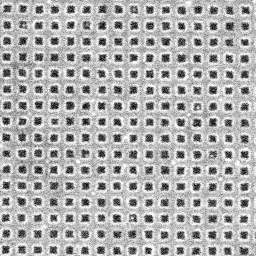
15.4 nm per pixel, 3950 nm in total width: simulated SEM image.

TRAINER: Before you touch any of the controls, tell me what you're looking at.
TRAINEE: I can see a regular array of holes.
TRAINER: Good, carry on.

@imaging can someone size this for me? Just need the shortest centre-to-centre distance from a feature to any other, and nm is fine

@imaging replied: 241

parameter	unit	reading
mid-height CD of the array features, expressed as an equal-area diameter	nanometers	159